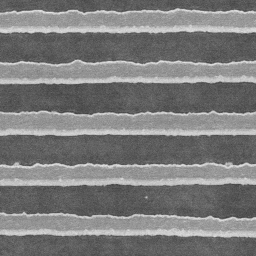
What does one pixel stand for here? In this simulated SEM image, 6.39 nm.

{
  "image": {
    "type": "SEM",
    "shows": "lines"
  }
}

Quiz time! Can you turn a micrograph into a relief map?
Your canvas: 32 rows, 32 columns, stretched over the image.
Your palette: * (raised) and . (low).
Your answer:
................................
.*****..**..***.**********.*****
********************************
********************************
................................
................................
................................
................................
********************************
********************************
................................
................................
................................
................................
********************************
********************************
********************************
................................
................................
................................
......**..**.............**...*.
********************************
********************************
................................
................................
................................
................................
********************************
********************************
................................
................................
................................